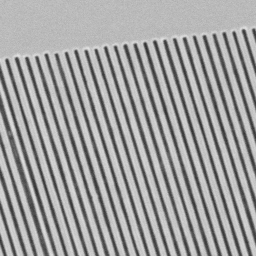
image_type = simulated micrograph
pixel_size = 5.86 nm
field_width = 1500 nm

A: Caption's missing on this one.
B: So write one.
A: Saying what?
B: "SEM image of parallel lines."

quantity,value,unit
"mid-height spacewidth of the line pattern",4.42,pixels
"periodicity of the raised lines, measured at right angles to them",0.0573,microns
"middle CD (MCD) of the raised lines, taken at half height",0.0308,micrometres